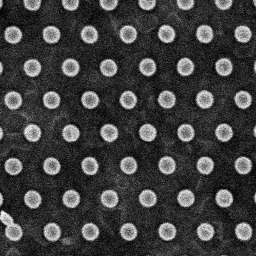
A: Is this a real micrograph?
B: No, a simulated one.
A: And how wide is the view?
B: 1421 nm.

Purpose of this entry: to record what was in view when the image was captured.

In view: a regular array of raised bodies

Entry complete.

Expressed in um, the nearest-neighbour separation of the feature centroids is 0.209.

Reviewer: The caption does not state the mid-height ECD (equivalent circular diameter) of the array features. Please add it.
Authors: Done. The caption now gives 92.4 nm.